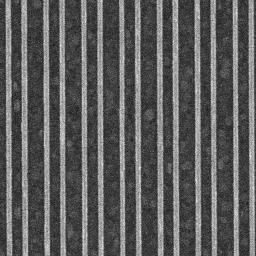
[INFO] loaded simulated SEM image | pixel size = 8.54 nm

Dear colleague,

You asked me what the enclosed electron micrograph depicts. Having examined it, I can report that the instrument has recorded parallel lines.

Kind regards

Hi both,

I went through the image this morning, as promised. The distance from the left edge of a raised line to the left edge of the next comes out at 159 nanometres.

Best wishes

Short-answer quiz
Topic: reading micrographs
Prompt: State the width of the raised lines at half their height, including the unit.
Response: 0.0448 um